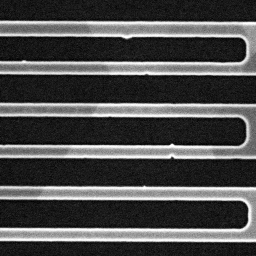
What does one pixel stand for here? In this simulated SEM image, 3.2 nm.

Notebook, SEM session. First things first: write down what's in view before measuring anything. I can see parallel lines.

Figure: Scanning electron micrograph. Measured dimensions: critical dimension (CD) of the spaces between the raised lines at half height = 96.1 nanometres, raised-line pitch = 0.132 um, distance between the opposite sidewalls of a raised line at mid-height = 38.4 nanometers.